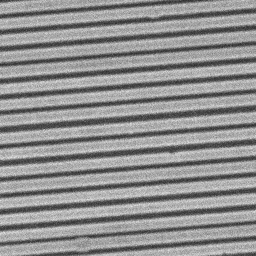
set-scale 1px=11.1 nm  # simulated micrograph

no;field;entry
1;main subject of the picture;parallel lines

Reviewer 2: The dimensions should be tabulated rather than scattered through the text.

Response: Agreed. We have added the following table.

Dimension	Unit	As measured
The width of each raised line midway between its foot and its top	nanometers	103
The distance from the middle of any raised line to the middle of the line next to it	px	16.2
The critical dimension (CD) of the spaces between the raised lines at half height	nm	74.9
